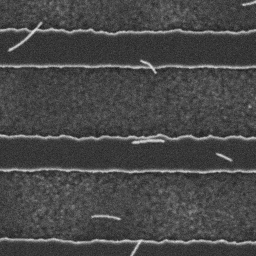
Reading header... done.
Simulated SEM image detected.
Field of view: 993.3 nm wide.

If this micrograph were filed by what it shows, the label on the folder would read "lines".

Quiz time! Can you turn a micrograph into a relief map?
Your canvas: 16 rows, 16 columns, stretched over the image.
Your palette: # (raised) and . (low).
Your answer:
................
................
################
################
................
................
................
................
##..............
################
################
................
................
................
................
################